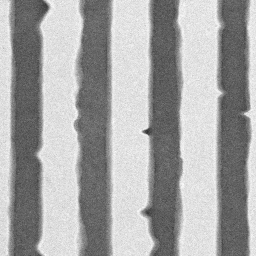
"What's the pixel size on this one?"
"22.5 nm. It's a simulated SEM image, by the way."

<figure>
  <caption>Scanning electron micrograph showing one or a few lines or trenches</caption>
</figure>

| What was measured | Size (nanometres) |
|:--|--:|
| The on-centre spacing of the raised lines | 1560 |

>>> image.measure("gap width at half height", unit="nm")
654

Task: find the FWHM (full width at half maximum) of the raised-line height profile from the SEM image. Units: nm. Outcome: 899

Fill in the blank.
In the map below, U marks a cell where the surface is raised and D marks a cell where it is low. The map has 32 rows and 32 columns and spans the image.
UDDDDDUUUUDDDDUUUUUDDDUUUUUDDDDU
UDDDDDUUUUDDDDUUUUUDDDUUUUUDDDDU
UDDDDUUUUUDDDDUUUUUDDDUUUUUDDDDU
UDDDDUUUUUDDDDUUUUUDDDUUUUUUDDDU
UDDDDUUUUUDDDDUUUUUDDDUUUUUDDDDU
UDDDDUUUUUDDDDUUUUUDDDUUUUUDDDDU
UUDDDUUUUUDDDDUUUUUDDDUUUUUDDDDU
UUDDDUUUUUDDDDUUUUUDDDUUUUUDDDDU
UUDDDUUUUUDDDDUUUUUDDDUUUUUDDDDU
UUDDDUUUUUDDDDUUUUUDDDDUUUUDDDDU
UDDDDUUUUUDDDDUUUUUDDDDUUUUDDDDU
UDDDDUUUUUDDDDUUUUUDDDDUUUUUDDDU
UDDDDUUUUUDDDDUUUUUDDDDUUUUDDDDU
UDDDDUUUUUDDDDUUUUUDDDDUUUUDDDDU
UDDDDUUUUUDDDDUUUUUDDDUUUUUDDDDU
UDDDDUUUUDDDDDUUUUUDDDUUUUUDDDDU
UDDDDUUUUUDDDDUUUUDDDDUUUUUDDDDU
UDDDDUUUUUDDDDUUUUUDDDUUUUUDDDDU
UUDDDUUUUUDDDDUUUUUDDDUUUUUDDDDU
UUDDDUUUUUDDDDUUUUUDDDDUUUUDDDDU
UUDDDUUUUUDDDDUUUUUDDDDUUUUDDDDU
UUDDDUUUUUDDDDUUUUUDDDDUUUUDDDDU
UUDDDUUUUUDDDDUUUUUDDDUUUUUDDDDU
UUDDDUUUUUDDDDUUUUUDDDUUUUUDDDDU
UUDDDUUUUUDDDDUUUUUDDDUUUUUDDDDU
UDDDDUUUUUDDDDUUUUUDDDDUUUUDDDDU
UDDDDUUUUUDDDDUUUUDDDDUUUUUDDDDU
UDDDDUUUUUDDDDUUUUUDDDUUUUUDDDDU
UDDDDUUUUUDDDDUUUUUDDDUUUUUDDDDU
UDDDDUUUUUDDDDUUUUUDDDUUUUUDDDDU
UDDDDUUUUUDDDDUUUUUDDDUUUUUDDDDU
UDDDDUUUUUDDDDUUUUUDDDUUUUUDDDDU